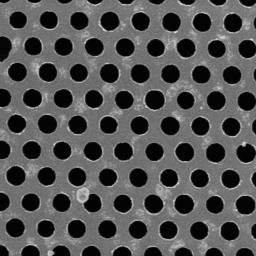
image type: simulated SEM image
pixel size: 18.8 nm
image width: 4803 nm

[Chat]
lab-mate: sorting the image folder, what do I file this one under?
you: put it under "a regular array of holes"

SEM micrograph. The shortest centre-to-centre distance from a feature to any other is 561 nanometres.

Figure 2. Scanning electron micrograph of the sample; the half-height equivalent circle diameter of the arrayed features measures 347 nanometers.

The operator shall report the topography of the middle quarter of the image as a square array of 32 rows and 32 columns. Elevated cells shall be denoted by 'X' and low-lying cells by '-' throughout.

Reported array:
XX---XXXXX---XXXX---XXXXXX--XXXX
XX----XXX-----XXX----XXXX----XXX
XX----XXX-----XXX-----XX-----XXX
XX----XXX-----XXX----XXXX----XXX
XXX-XXXXXX---XXXXX--XXXXX---XXXX
XXXXXXXXXXXXXXXXXXXXXXXXXXXXXXXX
-XXXXXXXXXXXXXXXXXXXXX-XXXXXXXXX
--XXXX---XXXX----XXXX----XXXX---
--XXX-----XXX----XXX-----XXX----
--XXX-----XXX----XXX-----XXX----
-XXXXX---XXXX----XXXX----XXXX---
XXXXXXXXXXXXXXXXXXXXXXXXXXXXXXXX
XXXXXXXXXXXXXXXXXXXXXXXXXXXXXXXX
XX---XXXXX--XXXXXX--XXXXX---XXXX
X-----XXX----XXXX----XXX-----XXX
X-----XXX----XXXX----XXX-----XXX
XX---XXXX----XXXX----XXX-----XXX
XXX-XXXXXXX-XXXXXX--XXXXX---XXXX
XXXXXXXXXXXXXXXXXXXXXXXXXXXXXXXX
XXXXXXX-XXXXXXXXXXXXXXXXXXXXXXXX
-XXXX----XXXX----XXXX---XXXX----
--XXX----XXX-----XXX-----XXX----
--XXX----XXXX----XXX-----XXX----
-XXXXX---XXXX----XXXX---XXXX----
XXXXXXXXXXXXXXXXXXXXXXXXXXXXXXXX
XXXXXXXXXXXXXXXXXXXXXXXXXXXXXXXX
XX---XXXXX--XXXXX---XXXXX--XXXXX
X----XXXX----XXX-----XXX----XXXX
X-----XXX----XXX-----XXX----XXXX
X----XXXX----XXXX----XXX----XXXX
XXX-XXXXXX--XXXXX---XXXXX---XXXX
XXXXXXXXXXXXXXXXXXXXXXXXXXXXXXXX